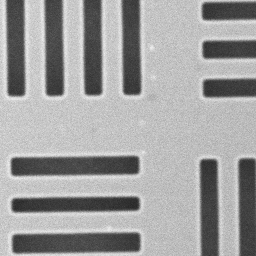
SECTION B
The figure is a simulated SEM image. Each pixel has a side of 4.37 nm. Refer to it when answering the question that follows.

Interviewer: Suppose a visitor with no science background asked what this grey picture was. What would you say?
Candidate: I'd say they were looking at groups of lines, slits or small figures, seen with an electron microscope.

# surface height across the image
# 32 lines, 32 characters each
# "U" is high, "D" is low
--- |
UDDUUDDDUUDDDUUDDDUUUUUUUDDDDDDD
UDDUUDDDUUDDDUUDDDUUUUUUUDDDDDDD
UDDUUDDDUUDDDUUDDDUUUUUUUUDDDDDD
UDDUUDDDUUDDDUUDDDUUUUUUUUUUUUUU
UDDUUDDDUUDDDUUDDDUUUUUUUUUUUUUU
UDDUUUDDUUDDDUUDDDUUUUUUUDDDDDDD
UDDUUUDDUUDDDUUDDDUUUUUUUDDDDDDD
UDDUUUDDUUDDDUUDDDUUUUUUUUUUUUUU
UDDUUUDDUUDDDUUDDDUUUUUUUUUUUUUU
UDDUUUDDUUDDDUUDDDUUUUUUUUUUUUUU
UDDUUUDDUUDDDUUDDDUUUUUUUDDDDDDD
UDDUUUDDUUUDDUUDDDUUUUUUUDDDDDDD
UUUUUUUUUUUUUUUUUUUUUUUUUUUUUUUU
UUUUUUUUUUUUUUUUUUUUUUUUUUUUUUUU
UUUUUUUUUUUUUUUUUUUUUUUUUUUUUUUU
UUUUUUUUUUUUUUUUUUUUUUUUUUUUUUUU
UUUUUUUUUUUUUUUUUUUUUUUUUUUUUUUU
UUUUUUUUUUUUUUUUUUUUUUUUUUUUUUUU
UUUUUUUUUUUUUUUUUUUUUUUUUUUUUUUU
UUUUUUUUUDDDDDDDDUUUUUUUUUUUUUUU
UDDDDDDDDDDDDDDDDDUUUUUUUDDUUUDD
UDDDDDDDDDDDDDDDDUUUUUUUUDDUUUDD
UUUUUUUUUUUUUUUUUUUUUUUUUDDUUUDD
UUUUUUUUUUUUUUUUUUUUUUUUUDDUUUDD
UUUUUUUUUUUUUUUUUUUUUUUUUDDUUUDD
UDDDDDDDDDDDDDDDDDUUUUUUUDDUUUDD
UUDDDDDDDDDDDUUUUUUUUUUUUDDUUUDD
UUUUUUUUUUUUUUUUUUUUUUUUUDDUUUDD
UUUUUUUUUUUUUUUUUUUUUUUUUDDUUUDD
UUDDDDDDDDDDDDDDDDUUUUUUUDDUUUDD
UDDDDDDDDDDDDDDDDDUUUUUUUDDUUUDD
UUDDDDDDDDDDDDDDDUUUUUUUUDDUUUDD